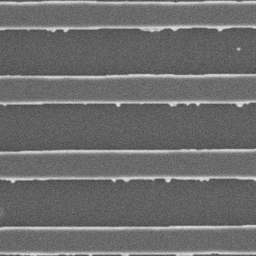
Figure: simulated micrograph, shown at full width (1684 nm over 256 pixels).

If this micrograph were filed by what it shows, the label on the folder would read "lines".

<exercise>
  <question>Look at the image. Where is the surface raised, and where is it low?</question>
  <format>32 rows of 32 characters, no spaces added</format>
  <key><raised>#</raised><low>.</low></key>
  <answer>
################################
################################
################################
#############...................
................................
................................
................................
................................
................................
..............##################
################################
################################
################################
................................
................................
................................
................................
................................
................................
################################
################################
################################
................................
................................
................................
................................
................................
................................
#############.##################
################################
################################
################################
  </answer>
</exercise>